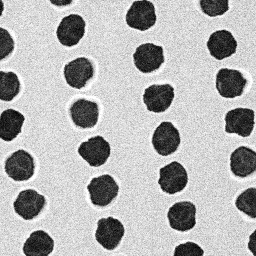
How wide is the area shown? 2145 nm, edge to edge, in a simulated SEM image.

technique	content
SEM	a regular array of holes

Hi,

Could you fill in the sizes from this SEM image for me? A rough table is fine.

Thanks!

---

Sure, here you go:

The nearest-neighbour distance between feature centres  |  335 nm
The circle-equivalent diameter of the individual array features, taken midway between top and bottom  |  258 nm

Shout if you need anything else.